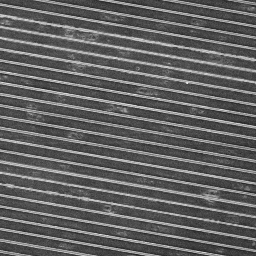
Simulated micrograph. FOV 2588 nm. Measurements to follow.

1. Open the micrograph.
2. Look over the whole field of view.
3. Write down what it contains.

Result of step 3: parallel lines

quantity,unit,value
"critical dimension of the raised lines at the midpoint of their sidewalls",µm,0.0174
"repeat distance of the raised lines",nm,112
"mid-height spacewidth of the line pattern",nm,94.5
